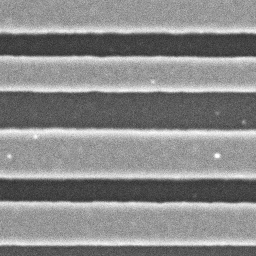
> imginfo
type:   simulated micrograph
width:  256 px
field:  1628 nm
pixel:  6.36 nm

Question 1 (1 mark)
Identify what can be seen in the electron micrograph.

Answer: lines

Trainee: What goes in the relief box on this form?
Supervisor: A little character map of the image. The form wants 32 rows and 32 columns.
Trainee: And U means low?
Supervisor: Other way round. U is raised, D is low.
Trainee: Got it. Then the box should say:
UUUUUUUUUUUUUUUUUUUUUUUUUUUUUUUU
UUUUUUUUUUUUUUUUUUUUUUUUUUUUUUUU
UUUUUUUUUUUUUUUUUUUUUUUUUUUUUUUU
UUUUUUUUUUUUUUUUUUUUUUUUUUUUUUUU
DDDDDDDDDDDDDDDDDDDDDDDDDDDDDDDD
DDDDDDDDDDDDDDDDDDDDDDDDDDDDDDDD
DDDDDDDDDDDDDDDDDDDDDDDDDDDDDDDD
UUUUUUUUUUUUUUUUUUUUUUUUUUUUUUUU
UUUUUUUUUUUUUUUUUUUUUUUUUUUUUUUU
UUUUUUUUUUUUUUUUUUUUUUUUUUUUUUUU
UUUUUUUUUUUUUUUUUUUUUUUUUUUUUUUU
DDDDDDDDDDDDDDDDDDDDDDDDDDDDDDDD
DDDDDDDDDDDDDDDDDDDDDDDDDDDDDDDD
DDDDDDDDDDDDDDDDDDDDDDDDDDDDDDDD
DDDDDDDDDDDDDDDDDDDDDDDDDDDDDDDD
DDDDDDDDDDDDDDDDDDDDDDDDDDDDDDDD
UUUUUUUUUUUUUUUUUUUUUUUUUUDDDDDD
UUUUUUUUUUUUUUUUUUUUUUUUUUUUUUUU
UUUUUUUUUUUUUUUUUUUUUUUUUUUUUUUU
UUUUUUUUUUUUUUUUUUUUUUUUUUUUUUUU
UUUUUUUUUUUUUUUUUUUUUUUUUUUUUUUU
UUUUUUUUUUUUUUUUUUUUUUUUUUUUUUUU
DDDDDDDDDDDDDDDDDDDDDDDDDDDDDDDD
DDDDDDDDDDDDDDDDDDDDDDDDDDDDDDDD
DDDDDDDDDDDDDDDDDDDDDDDDDDDDDDDD
UUUUUUUUUUUUUUUUUUUUUUUUUUUUUDUU
UUUUUUUUUUUUUUUUUUUUUUUUUUUUUUUU
UUUUUUUUUUUUUUUUUUUUUUUUUUUUUUUU
UUUUUUUUUUUUUUUUUUUUUUUUUUUUUUUU
UUUUUUUUUUUUUUUUUUUUUUUUUUUUUUUU
DDUUUUUUUUUUUUUUUUUUUUUUUUUUUUUU
DDDDDDDDDDDDDDDDDDDDDDDDDDDDDDDD